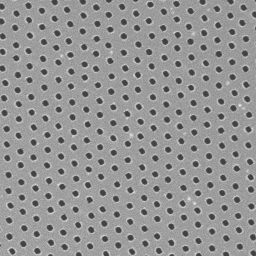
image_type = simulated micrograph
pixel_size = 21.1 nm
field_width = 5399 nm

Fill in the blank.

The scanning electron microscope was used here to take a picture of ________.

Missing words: a regular array of holes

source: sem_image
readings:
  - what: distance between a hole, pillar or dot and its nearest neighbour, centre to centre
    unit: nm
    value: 302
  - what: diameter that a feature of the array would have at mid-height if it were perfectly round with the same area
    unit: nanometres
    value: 130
